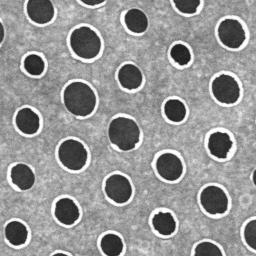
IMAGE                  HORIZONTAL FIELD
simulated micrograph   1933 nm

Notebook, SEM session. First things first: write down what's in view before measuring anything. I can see a regular array of holes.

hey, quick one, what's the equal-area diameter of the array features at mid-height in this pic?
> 195 nm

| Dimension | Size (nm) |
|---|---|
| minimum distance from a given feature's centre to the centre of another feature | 416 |